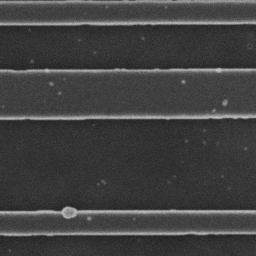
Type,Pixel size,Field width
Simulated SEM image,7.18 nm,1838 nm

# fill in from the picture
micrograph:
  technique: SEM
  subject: lines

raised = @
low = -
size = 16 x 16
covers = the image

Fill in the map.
@@@@@@@@@@@@@@@@
@@@-------------
----------------
----------------
@@@@@@@@@@@@@@@@
@@@@@@@@@@@@@@@@
@@@@@@@@@@@@@@@@
----------------
----------------
----------------
----------------
----------------
----------------
@@@@@@@@@@@@@@@@
@@@@@@@@@@@@@@@@
----------------